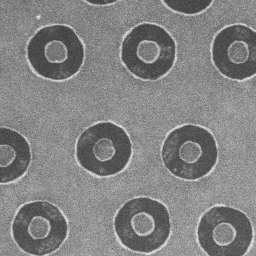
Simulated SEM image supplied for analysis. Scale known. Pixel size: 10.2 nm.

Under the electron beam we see ring-shaped raised bodies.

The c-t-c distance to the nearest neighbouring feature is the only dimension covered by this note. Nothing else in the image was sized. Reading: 85.9 px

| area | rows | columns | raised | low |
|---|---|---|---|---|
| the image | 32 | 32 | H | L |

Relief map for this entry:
LLLLLLLLLLLHHHLLLLLLLHHHHHLLLLLL
LLLLLLLLLLLLLLLLLLLLLLHHHLLLLLLL
LLLLLLLLLLLLLLLLLLLLLLLLLLLLLLLL
LLLLLHHHHLLLLLLLLHHHLLLLLLLLHHHL
LLLLHHHHHHLLLLLLHHHHHLLLLLLHHHHH
LLLHHHLLHHLLLLLHHHLHHHLLLLHHHLHH
LLLHHHLLHHHLLLLHHLLLHHLLLLHHHLLH
LLLHHHLLHHLLLLLHHHLHHHLLLLLHHLLH
LLLLHHHHHHLLLLLLHHHHHHLLLLLHHHHH
LLLLLHHHHLLLLLLLLHHHLLLLLLLLHHHH
LLLLLLLLLLLLLLLLLLLLLLLLLLLLLLLL
LLLLLLLLLLLLLLLLLLLLLLLLLLLLLLLL
LLLLLLLLLLLLLLLLLLLLLLLLLLLLLLLL
LLLLLLLLLLLLLLLLLLLLLLLLLLLLLLLL
LLLLLLLLLLLLLLLLLLLLLLLLLLLLLLLL
LLLLLLLLLLLLHHLLLLLLLLLHLLLLLLLL
HHLLLLLLLLHHHHHHLLLLLHHHHHLLLLLL
HHHLLLLLLLHHLLHHLLLLLHHHHHHLLLLL
LHHHLLLLLLHHLLHHLLLLHHHLLHHLLLLL
LLHHLLLLLLHHLLHHLLLLHHHLLHHLLLLL
LHHHLLLLLLHHHHHHLLLLHHHHHHHLLLLL
HHHLLLLLLLLHHHHLLLLLLHHHHHLLLLLL
HHLLLLLLLLLLLLLLLLLLLLLLHLLLLLLL
LLLLLLLLLLLLLLLLLLLLLLLLLLLLLLLL
LLLLLLLLLLLLLLLLLLLLLLLLLLLLLLLL
LLLHHHHLLLLLLLLHHHHHLLLLLLLLLLLL
LLHHHHHHLLLLLLLHHHHHHLLLLLHHHHLL
LLHHLLHHLLLLLLHHHLLHHLLLLHHHHHHL
LLHHLLHHLLLLLLHHHLLHHLLLLHHLLHHH
LLHHLLHHLLLLLLLHHHHHHLLLLHHLLHHH
LLHHHHHHLLLLLLLHHHHHHLLLLHHLHHHL
LLLHHHHLLLLLLLLLLHHLLLLLLLHHHHHL